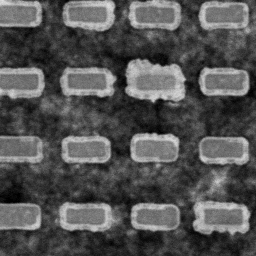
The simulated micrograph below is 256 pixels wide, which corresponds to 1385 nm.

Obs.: a regular array of raised bodies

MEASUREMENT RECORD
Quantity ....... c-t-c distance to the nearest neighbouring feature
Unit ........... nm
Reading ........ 362